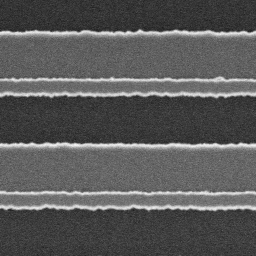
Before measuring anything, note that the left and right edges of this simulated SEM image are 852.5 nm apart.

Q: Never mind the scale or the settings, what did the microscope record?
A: lines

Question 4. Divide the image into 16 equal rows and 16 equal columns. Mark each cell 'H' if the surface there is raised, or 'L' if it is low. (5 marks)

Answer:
LLLLLLLLLLLLLLLL
LLLLLLLLLLLLLLLL
HHHHHHHHHHHHHHHH
HHHHHHHHHHHHHHHH
HHHHHHHHHHHHHHHH
HHHHHHHHHHHHHHHH
LLLLLLLLLLLLLLLL
LLLLLLLLLLLLLLLL
LLLLLLLLLLLLLLLL
HHHHHHHHHHHHHHHH
HHHHHHHHHHHHHHHH
HHHHHHHHHHHHHHHH
HHHHHHHHHHHHHHHH
LLLLLLLLLLLLLLLL
LLLLLLLLLLLLLLLL
LLLLLLLLLLLLLLLL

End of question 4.